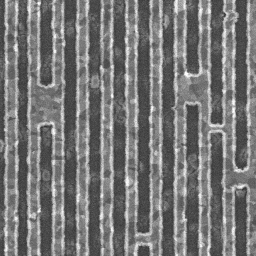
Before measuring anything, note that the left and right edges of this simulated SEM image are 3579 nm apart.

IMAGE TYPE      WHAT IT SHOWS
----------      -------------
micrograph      parallel lines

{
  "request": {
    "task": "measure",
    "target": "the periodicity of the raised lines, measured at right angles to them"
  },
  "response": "338 nanometers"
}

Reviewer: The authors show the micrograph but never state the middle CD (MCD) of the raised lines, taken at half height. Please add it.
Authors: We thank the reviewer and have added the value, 133 nm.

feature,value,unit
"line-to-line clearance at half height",217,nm